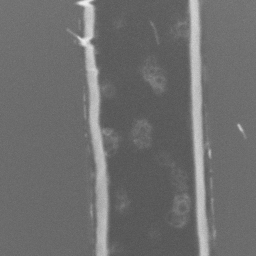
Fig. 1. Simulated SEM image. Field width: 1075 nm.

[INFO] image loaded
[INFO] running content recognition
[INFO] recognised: one or a few lines or trenches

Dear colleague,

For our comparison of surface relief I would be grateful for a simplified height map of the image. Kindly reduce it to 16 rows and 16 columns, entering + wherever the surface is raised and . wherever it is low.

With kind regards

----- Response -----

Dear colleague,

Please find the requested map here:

.....+++++++....
......++++++....
.....+++++++....
......++++++....
......++++++....
......++++++....
......++++++....
......++++++....
......++++++....
......++++++....
......++++++....
......+++++++...
......+++++++...
......+++++++...
......+++++++...
......+++++++...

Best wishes